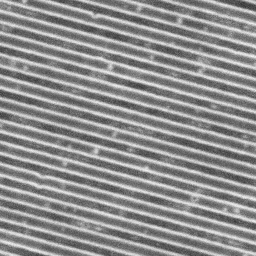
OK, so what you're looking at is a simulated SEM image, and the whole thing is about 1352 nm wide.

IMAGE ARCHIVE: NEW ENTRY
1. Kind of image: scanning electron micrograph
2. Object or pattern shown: parallel lines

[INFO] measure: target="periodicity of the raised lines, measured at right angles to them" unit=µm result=0.112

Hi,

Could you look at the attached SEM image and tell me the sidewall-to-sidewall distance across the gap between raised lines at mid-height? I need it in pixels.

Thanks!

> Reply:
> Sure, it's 8.83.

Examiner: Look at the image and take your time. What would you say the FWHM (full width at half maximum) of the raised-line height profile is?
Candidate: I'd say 61.8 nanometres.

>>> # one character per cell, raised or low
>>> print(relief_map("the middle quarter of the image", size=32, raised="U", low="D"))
DDDDUUUUUUUUUUUUDDDDDDDDDUUUUUUU
DDDDDDDDUUUUUUUUUUUDDDDDDDDDUUUU
UUUDDDDDDDDDUUUUUUUUUUUDDDDDDDDD
UUUUUUUDDDDDDDDUUUUUUUUUUUUDDDDD
UUUUUUUUUUDDDDDDDDDUUUUUUUUUUUUD
DDUUUUUUUUUUUUDDDDDDDDDUUUUUUUUU
DDDDDDUUUUUUUUUUUUDDDDDDDDDUUUUU
UDDDDDDDDDUUUUUUUUUUUUDDDDDDDDUU
UUUUUDDDDDDDDUUUUUUUUUUUUDDDDDDD
UUUUUUUUDDDDDDDDDUUUUUUUUUUUUDDD
DUUUUUUUUUUUDDDDDDDDDUUUUUUUUUUU
DDDDDUUUUUUUUUUUDDDDDDDDDUUUUUUU
DDDDDDDDDUUUUUUUUUUUDDDDDDDDUUUU
UUUDDDDDDDDDUUUUUUUUUUUDDDDDDDDD
UUUUUUDDDDDDDDDDUUUUUUUUUUUDDDDD
UUUUUUUUUUDDDDDDDDDDUUUUUUUUUUUD
DDDUUUUUUUUUUUDDDDDDDDDUUUUUUUUU
DDDDDDUUUUUUUUUUUUDDDDDDDDDUUUUU
UUDDDDDDDDUUUUUUUUUUUDDDDDDDDDDU
UUUUUDDDDDDDDDUUUUUUUUUUUDDDDDDD
UUUUUUUUUDDDDDDDDDUUUUUUUUUUUDDD
DUUUUUUUUUUUUDDDDDDDDUUUUUUUUUUU
DDDDUUUUUUUUUUUUDDDDDDDDDUUUUUUU
DDDDDDDDUUUUUUUUUUUUDDDDDDDDDUUU
UUUDDDDDDDDDUUUUUUUUUUUDDDDDDDDD
UUUUUUUDDDDDDDDDUUUUUUUUUUUUDDDD
UUUUUUUUUUUDDDDDDDDUUUUUUUUUUUUD
DDDUUUUUUUUUUUDDDDDDDDDUUUUUUUUU
DDDDDDUUUUUUUUUUUUDDDDDDDDDUUUUU
UDDDDDDDDDUUUUUUUUUUUUDDDDDDDDDU
UUUUUDDDDDDDDDUUUUUUUUUUUUDDDDDD
UUUUUUUUUDDDDDDDDUUUUUUUUUUUUDDD